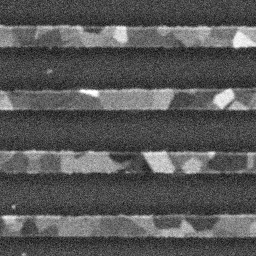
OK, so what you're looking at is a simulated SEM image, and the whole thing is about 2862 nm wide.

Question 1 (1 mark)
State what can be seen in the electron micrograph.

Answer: lines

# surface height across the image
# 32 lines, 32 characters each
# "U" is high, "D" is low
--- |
DDDDDDDDDDDDDDDDDDDDDDDDDDDDDDDD
DDDDDDDDDDDDDDDDDDDDDDDDDDDDDDDD
DDDDDDDDDDDDDDDDDDDDDDDDDDDDDDDD
UUUUUUUUUUUUUUUUUUUUUUUUUUUUUUUU
UUUUUUUUUUUUUUUUUUUUUUUUUUUUUUUU
UUUUUUUUUUUUUUUUUUUUUUUUUUUUUUUU
DDDDDDDDDDDDDDDDDDDDDDDDDDDDDDDD
DDDDDDDDDDDDDDDDDDDDDDDDDDDDDDDD
DDDDDDDDDDDDDDDDDDDDDDDDDDDDDDDD
DDDDDDDDDDDDDDDDDDDDDDDDDDDDDDDD
DDDDDDDDDDDDDDDDDDDDDDDDDDDDDDDD
UUUUUUUUUUUUUUUUUUUUUUUUUUUUUUUU
UUUUUUUUUUUUUUUUUUUUUUUUUUUUUUUU
UUUUUUUUUUUUUUUUUUUUUDUUUUUUUUUU
DDDDDDDDDDDDDDDDDDDDDDDDDDDDDDDD
DDDDDDDDDDDDDDDDDDDDDDDDDDDDDDDD
DDDDDDDDDDDDDDDDDDDDDDDDDDDDDDDD
DDDDDDDDDDDDDDDDDDDDDDDDDDDDDDDD
DDDDDDDDDDDDDDDDDDDDDDDDDDDDDDDD
UUUUUUUUUUUUUUUUUUUUUUUUUUUUUUUU
UUUUUUUUUUUUUUUUUUUUUUUUUUUUUUUU
DDDUUDDDDDUDDDUUDDDUDUUUUDUUUDDD
DDDDDDDDDDDDDDDDDDDDDDDDDDDDDDDD
DDDDDDDDDDDDDDDDDDDDDDDDDDDDDDDD
DDDDDDDDDDDDDDDDDDDDDDDDDDDDDDDD
DDDDDDDDDDDDDDDDDDDDDDDDDDDDDDDD
DDDDDDDDDDDDDDDDDDDDDDDDDDDDDDDD
UUUUUUUUUUUUUUUUUUUUUUUUUUUUUUUU
UUUUUUUUUUUUUUUUUUUUUUUUUUUUUUUU
DDDDDDDDDDDDDDDUUDDUUUUUUUUUUUUU
DDDDDDDDDDDDDDDDDDDDDDDDDDDDDDDD
DDDDDDDDDDDDDDDDDDDDDDDDDDDDDDDD